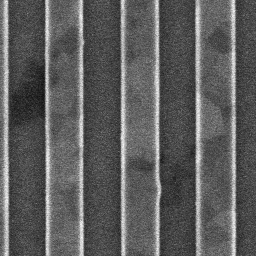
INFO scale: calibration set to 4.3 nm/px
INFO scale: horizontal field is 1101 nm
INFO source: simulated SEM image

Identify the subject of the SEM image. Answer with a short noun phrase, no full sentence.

one or a few lines or trenches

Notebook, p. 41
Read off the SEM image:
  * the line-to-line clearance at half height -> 174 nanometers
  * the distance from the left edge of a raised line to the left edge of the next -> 326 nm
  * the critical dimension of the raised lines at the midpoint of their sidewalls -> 150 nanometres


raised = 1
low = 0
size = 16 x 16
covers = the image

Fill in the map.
0001100011001110
0001100011001110
0001100011001110
0001100011001110
0001100011001110
0001100011001110
0001100011001110
0001100011001110
0001100011001110
0001100011001110
0001100011001110
0001100011001110
0001100011001110
0001100011001110
0001100011001110
0001100011001110